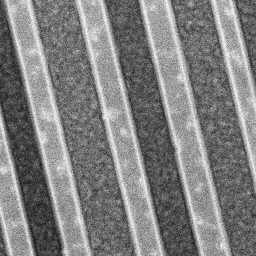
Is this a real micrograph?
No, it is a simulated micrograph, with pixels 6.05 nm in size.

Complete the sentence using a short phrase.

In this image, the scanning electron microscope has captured one or a few lines or trenches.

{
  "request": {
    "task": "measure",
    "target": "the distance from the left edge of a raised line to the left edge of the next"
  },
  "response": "398 nanometres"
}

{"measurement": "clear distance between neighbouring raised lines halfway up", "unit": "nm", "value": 252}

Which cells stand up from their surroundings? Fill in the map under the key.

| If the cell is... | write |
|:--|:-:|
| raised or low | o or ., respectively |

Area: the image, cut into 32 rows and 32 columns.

.ooo......ooo.....ooo......oo...
.ooo......ooo.....ooo......oo...
.ooo......ooo.....oooo.....ooo..
.oooo.....oooo....oooo.....ooo..
..ooo......ooo.....ooo......oo..
..ooo......ooo.....ooo......oo..
..ooo......ooo.....oooo.....ooo.
..ooo......oooo....oooo.....ooo.
...ooo......ooo....oooo.....ooo.
...ooo......ooo.....ooo......oo.
...ooo......ooo.....oooo.....ooo
...ooo......oooo....oooo.....ooo
....ooo......ooo....oooo......oo
....ooo......ooo.....ooo......oo
....ooo......ooo.....ooo......oo
....ooo......oooo....oooo.....oo
o....ooo......ooo....oooo.....oo
o....ooo......ooo.....ooo......o
o....ooo......ooo.....ooo......o
o....ooo......ooo.....oooo.....o
oo....ooo.....oooo....oooo.....o
oo....ooo......ooo.....ooo......
oo....ooo......ooo.....ooo......
oo....ooo......ooo.....oooo.....
ooo...oooo.....oooo....oooo.....
ooo....ooo......ooo.....ooo.....
ooo....ooo......ooo.....ooo.....
ooo....ooo......ooo.....oooo....
oooo...oooo.....oooo....oooo....
.ooo....ooo......ooo....oooo....
.ooo....ooo......ooo.....ooo....
.ooo....ooo......ooo.....oooo...